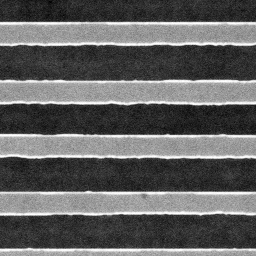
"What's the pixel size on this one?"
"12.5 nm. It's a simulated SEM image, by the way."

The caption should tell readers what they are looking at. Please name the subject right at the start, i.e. lines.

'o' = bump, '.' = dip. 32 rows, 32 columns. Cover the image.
................................
................................
................................
oooooooooooooooooooooooooooooooo
oooooooooooooooooooooooooooooooo
ooooooooooo.o.ooooo..oo.oooooooo
................................
................................
................................
................................
oooooooooooooooooooooooooooooooo
oooooooooooooooooooooooooooooooo
oooooooooooooooooooooooooooooooo
................................
................................
................................
................................
oooooooooooooooooooooooooooooooo
oooooooooooooooooooooooooooooooo
o.oooooooooooooooooooooooooooooo
................................
................................
................................
................................
oooooooooooooooooooooooooooooooo
oooooooooooooooooooooooooooooooo
oooooooooooooooooooooooooooooooo
................................
................................
................................
................................
oooooooooooooooooooooooooooooooo